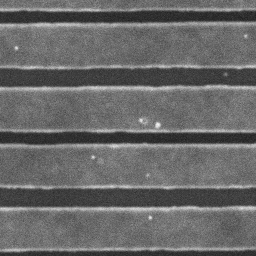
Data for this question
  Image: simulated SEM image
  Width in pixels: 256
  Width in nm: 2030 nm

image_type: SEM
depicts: lines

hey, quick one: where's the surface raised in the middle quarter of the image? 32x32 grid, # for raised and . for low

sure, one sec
################################
................................
................................
................................
................................
................................
################################
################################
################################
################################
################################
################################
################################
################################
################################
################################
################################
................................
................................
................................
################################
################################
################################
################################
################################
################################
################################
################################
################################
################################
################################
................................